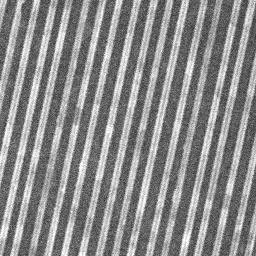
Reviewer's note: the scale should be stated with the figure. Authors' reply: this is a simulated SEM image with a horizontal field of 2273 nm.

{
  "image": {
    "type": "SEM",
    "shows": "parallel lines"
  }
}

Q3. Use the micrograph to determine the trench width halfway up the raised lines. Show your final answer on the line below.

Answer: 0.0988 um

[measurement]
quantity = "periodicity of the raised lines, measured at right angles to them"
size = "144 nm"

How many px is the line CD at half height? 5.12